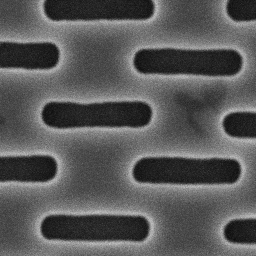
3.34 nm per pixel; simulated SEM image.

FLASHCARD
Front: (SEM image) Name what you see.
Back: holes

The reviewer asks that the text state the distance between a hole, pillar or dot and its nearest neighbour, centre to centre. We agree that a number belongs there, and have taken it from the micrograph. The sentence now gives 0.353 µm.